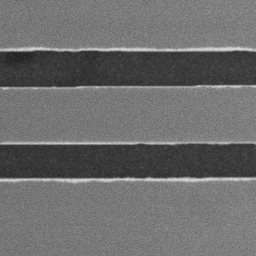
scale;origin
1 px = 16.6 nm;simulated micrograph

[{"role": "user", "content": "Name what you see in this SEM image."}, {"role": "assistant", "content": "lines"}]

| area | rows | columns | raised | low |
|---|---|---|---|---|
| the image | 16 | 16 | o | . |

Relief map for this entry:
oooooooooooooooo
oooooooooooooooo
oooooooooooooooo
................
................
oooooooooooooooo
oooooooooooooooo
oooooooooooooooo
oooooooooooooooo
................
................
oooooooooooooooo
oooooooooooooooo
oooooooooooooooo
oooooooooooooooo
oooooooooooooooo